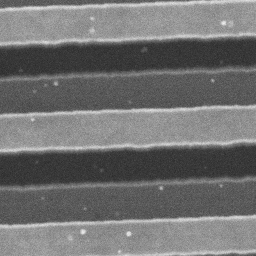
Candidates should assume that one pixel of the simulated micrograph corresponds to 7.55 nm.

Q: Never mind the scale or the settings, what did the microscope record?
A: lines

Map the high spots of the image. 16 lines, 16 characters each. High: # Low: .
################
################
#########.......
................
...........#####
################
################
################
################
#...............
................
.........#######
################
################
################
################